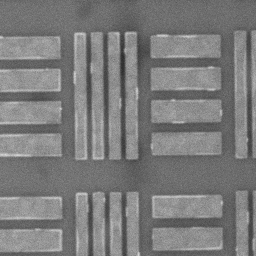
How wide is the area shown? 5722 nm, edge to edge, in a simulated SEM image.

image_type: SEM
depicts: groups of lines, slits or small figures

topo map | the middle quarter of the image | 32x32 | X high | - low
---XX--XXX-XXX-XXX--------------
---XX--XXX-XXX-XXX----XXXXXXXXXX
---XX--XXX-XXX-XXX----XXXXXXXXXX
---XX--XXX-XXX--XX----XXXXXXXXXX
---XX--XXX-XXX--XX----XXXXXXXXXX
---XX--XXX-XXX--XX----XXXXXXXXXX
---XX--XXX-XXX--XX--------------
---XX--XXX-XXX--XX--------------
---XX--XXX-XXX--XX--------------
---XX--XXX-XXX--XX----XXXXXXXXXX
---XX--XXX-XXX--XX----XXXXXXXXXX
---XX--XXX-XXX--XX----XXXXXXXXXX
---XX--XXX-XXX--XX----XXXXXXXXXX
---XX--XXX-XXX--XX----XXXXXXXXXX
---XX---X---XX--XX--------------
---XX---X---XX--XX--------------
---XX---X---XX--XX--------------
---XX---X---XX--XX----XXXXXXXXXX
---XX---X---XX--XX----XXXXXXXXXX
---XX---XX--XX--XX----XXXXXXXXXX
---XX---XX-XXX--XX----XXXXXXXXXX
---XX---XX-XXX--XX----XXXXXXXXXX
---XX--XXX-XXX--XX----XXXXX-----
---XX-------XX--XX--------------
--------------------------------
--------------------------------
--------------------------------
--------------------------------
--------------------------------
--------------------------------
--------------------------------
--------------------------------